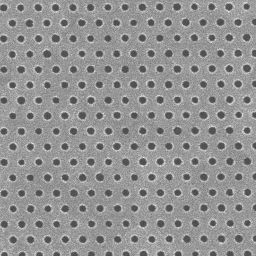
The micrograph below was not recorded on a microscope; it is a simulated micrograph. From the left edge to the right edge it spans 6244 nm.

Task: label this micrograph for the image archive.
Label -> a regular array of holes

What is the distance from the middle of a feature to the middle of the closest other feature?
420 nm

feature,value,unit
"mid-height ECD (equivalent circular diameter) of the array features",178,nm